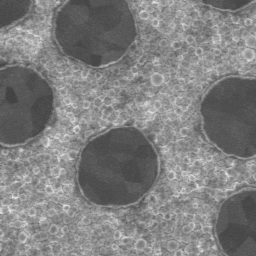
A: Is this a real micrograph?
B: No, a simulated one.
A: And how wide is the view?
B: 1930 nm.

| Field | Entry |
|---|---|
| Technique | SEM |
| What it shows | raised bodies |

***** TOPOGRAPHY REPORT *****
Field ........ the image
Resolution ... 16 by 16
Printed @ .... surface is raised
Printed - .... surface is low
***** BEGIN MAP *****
@@--@@@@-----@@-
@--@@@@@--------
---@@@@@--------
----@@@@--------
@@--------------
@@@----------@@@
@@@----------@@@
@@@----------@@@
@@----@@@----@@@
-----@@@@@----@@
-----@@@@@------
-----@@@@@------
------@@@-----@@
--------------@@
-------------@@@
--------------@@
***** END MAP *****